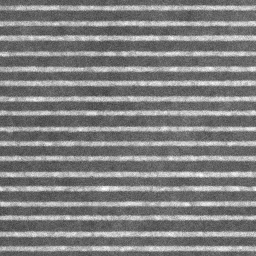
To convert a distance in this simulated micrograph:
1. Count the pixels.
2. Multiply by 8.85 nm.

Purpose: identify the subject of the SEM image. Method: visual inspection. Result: parallel lines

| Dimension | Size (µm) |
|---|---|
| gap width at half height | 0.0974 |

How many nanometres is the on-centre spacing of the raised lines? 133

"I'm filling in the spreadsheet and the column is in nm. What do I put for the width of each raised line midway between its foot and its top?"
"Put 34.3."